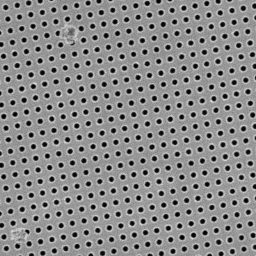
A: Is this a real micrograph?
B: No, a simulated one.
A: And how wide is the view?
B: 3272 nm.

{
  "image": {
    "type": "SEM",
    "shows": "a regular array of holes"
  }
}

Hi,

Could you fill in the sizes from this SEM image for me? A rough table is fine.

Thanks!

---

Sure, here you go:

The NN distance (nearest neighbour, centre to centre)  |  146 nanometres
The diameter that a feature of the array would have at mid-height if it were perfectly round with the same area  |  72.1 nm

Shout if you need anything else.